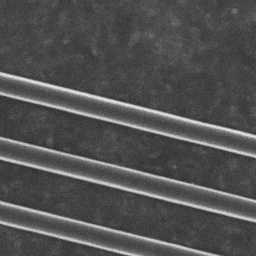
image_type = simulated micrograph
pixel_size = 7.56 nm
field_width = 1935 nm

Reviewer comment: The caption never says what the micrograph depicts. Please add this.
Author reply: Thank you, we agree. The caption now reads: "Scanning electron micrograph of parallel lines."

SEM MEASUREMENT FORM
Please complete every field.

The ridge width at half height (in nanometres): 148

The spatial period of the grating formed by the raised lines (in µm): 0.473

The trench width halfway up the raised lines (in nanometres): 325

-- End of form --